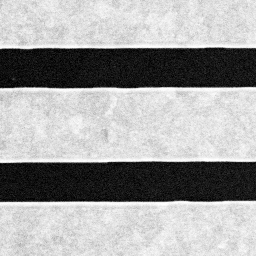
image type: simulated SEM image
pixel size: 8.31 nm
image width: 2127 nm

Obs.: wiring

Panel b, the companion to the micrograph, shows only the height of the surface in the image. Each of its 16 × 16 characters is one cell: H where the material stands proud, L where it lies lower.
HHHHHHHHHHHHHHHH
HHHHHHHHHHHHHHHH
HHHHHHHHHHHHHHHH
LLLLLLLLLLLLLLLL
LLLLLLLLLLLLLLLL
LLLLLLLLLLLLLLLL
HHHHHHHHHHHHHHHH
HHHHHHHHHHHHHHHH
HHHHHHHHHHHHHHHH
HHHHHHHHHHHHHHHH
LLLLLLLLLLLLLLLL
LLLLLLLLLLLLLLLL
LLLLLLLLLLLLLLLL
HHHHHHHHHHHHHHHH
HHHHHHHHHHHHHHHH
HHHHHHHHHHHHHHHH